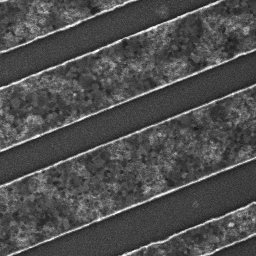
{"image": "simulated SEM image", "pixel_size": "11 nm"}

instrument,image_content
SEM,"one or a few lines or trenches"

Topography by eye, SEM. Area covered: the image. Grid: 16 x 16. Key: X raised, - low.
XXXXXXX------XXX
XXXXX-----XXXXXX
XX------XXXXXXXX
-----XXXXXXXXXX-
---XXXXXXXXXX---
XXXXXXXXXX-----X
XXXXXXX------XXX
XXXXX-----XXXXXX
XX------XXXXXXXX
-----XXXXXXXXXXX
---XXXXXXXXXXX--
XXXXXXXXXXXX----
XXXXXXXXX-------
XXXXXXX-------XX
XXXX-------XXXXX
XX-------XXXXX--